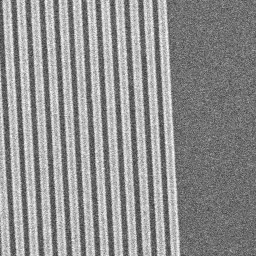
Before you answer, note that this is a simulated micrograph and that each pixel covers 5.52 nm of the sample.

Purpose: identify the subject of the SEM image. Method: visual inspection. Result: parallel lines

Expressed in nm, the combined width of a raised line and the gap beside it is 77.7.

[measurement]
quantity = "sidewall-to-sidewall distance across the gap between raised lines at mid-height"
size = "42.7 nm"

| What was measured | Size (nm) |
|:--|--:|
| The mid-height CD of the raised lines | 37.9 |